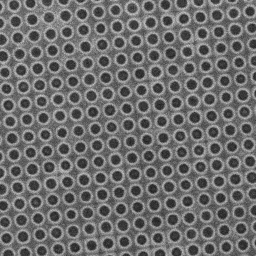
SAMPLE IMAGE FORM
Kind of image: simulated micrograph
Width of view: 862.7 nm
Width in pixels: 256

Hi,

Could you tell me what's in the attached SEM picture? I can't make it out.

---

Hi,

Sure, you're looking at a regular array of holes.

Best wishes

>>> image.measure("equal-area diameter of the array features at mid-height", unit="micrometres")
0.037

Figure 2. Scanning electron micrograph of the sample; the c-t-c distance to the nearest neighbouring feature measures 55 nm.